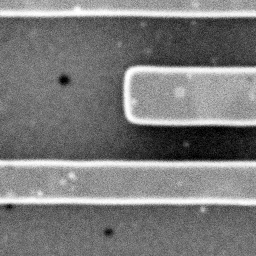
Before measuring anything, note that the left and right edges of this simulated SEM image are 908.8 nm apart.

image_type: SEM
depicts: groups of lines, slits or small figures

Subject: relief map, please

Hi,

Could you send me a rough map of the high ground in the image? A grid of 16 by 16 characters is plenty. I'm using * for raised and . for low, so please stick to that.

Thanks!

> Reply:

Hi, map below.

****************
................
................
................
........********
........********
........********
........********
................
................
****************
****************
****************
................
................
................